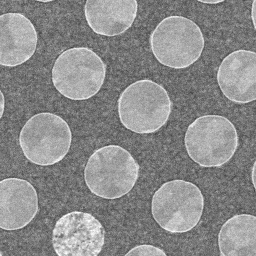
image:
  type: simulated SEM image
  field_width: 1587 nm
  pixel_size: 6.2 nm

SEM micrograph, raised bodies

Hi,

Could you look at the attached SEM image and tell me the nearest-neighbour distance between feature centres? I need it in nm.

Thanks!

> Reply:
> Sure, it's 454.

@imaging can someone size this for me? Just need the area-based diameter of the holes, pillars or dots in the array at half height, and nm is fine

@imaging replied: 322